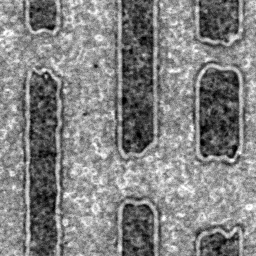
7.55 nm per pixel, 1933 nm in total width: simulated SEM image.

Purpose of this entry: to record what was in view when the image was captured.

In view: one or a few lines or trenches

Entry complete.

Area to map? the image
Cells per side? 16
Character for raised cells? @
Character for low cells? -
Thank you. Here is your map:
--@@---@@@--@@@-
--@@---@@@--@@@-
-------@@@---@@-
-------@@@------
--@----@@@---@@-
--@@----@@--@@@-
--@@----@@--@@@-
--@@----@@--@@@-
--@@----@@--@@@-
--@@----@---@@@-
--@@------------
--@@------------
--@@------------
--@@----@@------
--@@----@@---@--
--@@----@@--@@@-